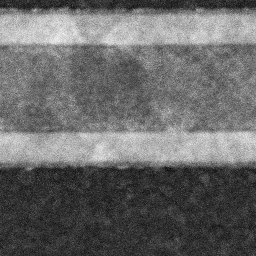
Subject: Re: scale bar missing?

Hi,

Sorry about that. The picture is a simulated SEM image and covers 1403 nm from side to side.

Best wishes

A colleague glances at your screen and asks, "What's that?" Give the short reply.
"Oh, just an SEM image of one or a few lines or trenches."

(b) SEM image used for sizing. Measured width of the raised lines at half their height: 0.633 um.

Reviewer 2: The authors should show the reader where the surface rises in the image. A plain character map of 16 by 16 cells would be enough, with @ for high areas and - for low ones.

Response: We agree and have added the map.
----------------
----------------
@@@@@@@@@@@@@@@@
@@@@@@@@@@@@@@@@
@@@@@@@@@@@@@@@@
@@@@@@@@@@@@@@@@
@@@@@@@@@@@@@@@@
@@@@@@@@@@@@@@@@
@@@@@@@@@@@@@@@@
----------------
----------------
----------------
----------------
----------------
----------------
----------------